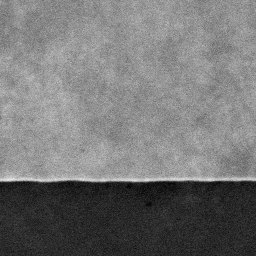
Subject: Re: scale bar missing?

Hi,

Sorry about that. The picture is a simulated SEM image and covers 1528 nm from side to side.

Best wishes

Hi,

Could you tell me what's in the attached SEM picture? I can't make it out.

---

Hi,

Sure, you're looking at wiring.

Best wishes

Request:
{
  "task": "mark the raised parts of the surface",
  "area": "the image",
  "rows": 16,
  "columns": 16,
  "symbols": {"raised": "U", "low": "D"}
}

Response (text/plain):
UUUUUUUUUUUUUUUU
UUUUUUUUUUUUUUUU
UUUUUUUUUUUUUUUU
UUUUUUUUUUUUUUUU
UUUUUUUUUUUUUUUU
UUUUUUUUUUUUUUUU
UUUUUUUUUUUUUUUU
UUUUUUUUUUUUUUUU
UUUUUUUUUUUUUUUU
UUUUUUUUUUUUUUUU
UUUUUUUUUUUUUUUU
DDDDDDDDDDDDDDDD
DDDDDDDDDDDDDDDD
DDDDDDDDDDDDDDDD
DDDDDDDDDDDDDDDD
DDDDDDDDDDDDDDDD